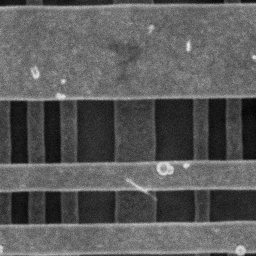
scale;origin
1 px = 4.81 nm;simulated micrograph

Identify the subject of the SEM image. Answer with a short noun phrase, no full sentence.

wiring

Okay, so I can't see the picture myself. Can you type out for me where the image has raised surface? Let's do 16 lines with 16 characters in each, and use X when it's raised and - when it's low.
XXXXXXXXXXXXXXXX
XXXXXXXXXXXXXXXX
XXXXXXXXXXXXXXXX
XXXXXXXXXXXXXXXX
XXXXXXXXXXXXXXXX
XXXXXXXXXXXXXXXX
----------------
----------------
----------------
----------------
XXXXXXXXXXXXXXXX
XXXXXXXXXXXXXXXX
----------------
----------------
XXXXXXXXXXXXXXXX
XXXXXXXXXXXXXXXX